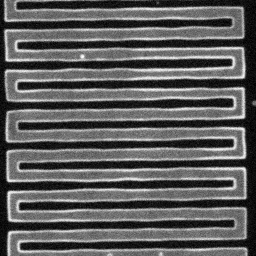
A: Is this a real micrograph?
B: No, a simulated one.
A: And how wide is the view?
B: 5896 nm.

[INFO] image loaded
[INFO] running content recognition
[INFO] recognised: groups of lines, slits or small figures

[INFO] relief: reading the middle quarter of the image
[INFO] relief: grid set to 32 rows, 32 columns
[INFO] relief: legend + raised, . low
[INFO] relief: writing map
................................
++++++....++++++++....++++++++++
++++++++++++++++++++++++++++++++
++++++++++++++++++++............
................................
................................
......++++++++++++++++++++++++++
++++++++++++++++++++++++++++++++
++++++++++++++++++++++++++++++++
................................
................................
...+++....++++++++++++++++++++++
++++++++++++++++++++++++++++++++
++++++++++++++++++++++++++++++++
................................
................................
......++++++++++++++++++++++++++
++++++++++++++++++++++++++++++++
++++++++++++++++++++++++++++++++
................................
................................
+++++++++..+++++++++++++++++++++
++++++++++++++++++++++++++++++++
++++++++++++++++++++++++++++++++
................................
................................
............+.....++++++++++++++
++++++++++++++++++++++++++++++++
++++++++++++++++++++++++++++++++
................................
................................
....+++++++++++....+++++++++++++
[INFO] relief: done